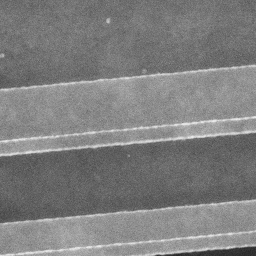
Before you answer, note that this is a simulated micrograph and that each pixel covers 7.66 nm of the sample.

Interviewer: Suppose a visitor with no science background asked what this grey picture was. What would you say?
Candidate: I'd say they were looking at lines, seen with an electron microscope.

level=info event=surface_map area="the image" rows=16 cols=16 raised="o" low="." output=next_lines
................
................
................
................
............oooo
.ooooooooooooooo
oooooooooooooooo
oooooooooooooooo
ooooooooooooo...
ooo.............
................
................
................
.....ooooooooooo
oooooooooooooooo
oooooooooooooo..